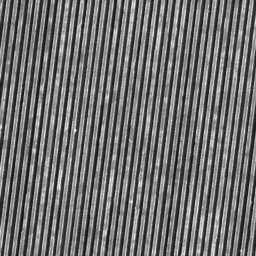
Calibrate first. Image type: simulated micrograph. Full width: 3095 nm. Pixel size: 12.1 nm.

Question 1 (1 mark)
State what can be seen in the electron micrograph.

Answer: parallel lines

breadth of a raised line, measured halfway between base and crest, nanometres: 46.4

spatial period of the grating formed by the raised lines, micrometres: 0.0885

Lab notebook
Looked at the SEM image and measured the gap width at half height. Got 0.0464 um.